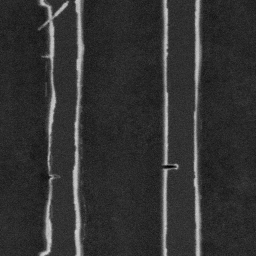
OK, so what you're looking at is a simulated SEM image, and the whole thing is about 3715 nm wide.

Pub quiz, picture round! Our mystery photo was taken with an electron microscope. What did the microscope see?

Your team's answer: one or a few lines or trenches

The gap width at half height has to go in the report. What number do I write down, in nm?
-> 1260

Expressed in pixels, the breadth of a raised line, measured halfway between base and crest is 30.1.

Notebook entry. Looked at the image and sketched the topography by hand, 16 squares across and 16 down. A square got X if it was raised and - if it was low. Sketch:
---XX-----XX----
---XX-----XX----
---XX-----XX----
---XX-----XX----
---XX-----XX----
---XX-----XX----
---XX-----XX----
---XX-----XX----
---XX-----XX----
---XX-----XX----
---XX-----XX----
---XX-----XX----
---XX-----XX----
---XX-----XX----
---XX-----XX----
---XX-----XX----